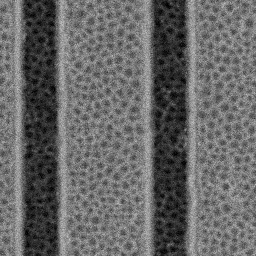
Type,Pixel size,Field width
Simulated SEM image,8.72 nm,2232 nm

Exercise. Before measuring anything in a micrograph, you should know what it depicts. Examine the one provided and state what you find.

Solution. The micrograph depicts one or a few lines or trenches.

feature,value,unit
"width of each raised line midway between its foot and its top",736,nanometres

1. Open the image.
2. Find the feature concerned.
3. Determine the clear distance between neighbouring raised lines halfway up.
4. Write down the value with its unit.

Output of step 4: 392 nm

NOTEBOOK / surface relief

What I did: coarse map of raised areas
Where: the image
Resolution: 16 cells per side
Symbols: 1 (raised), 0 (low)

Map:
1000111110001111
1000111110001111
1000111110001111
1000111110001111
1000111110001111
1000111110001111
1000111110001111
1000111110001111
1000111110001111
1000111110001111
1000111110001111
1000111110001111
1000111110001111
1000111110001111
1000111110001111
1000111110001111